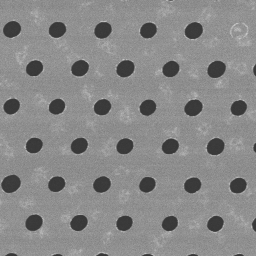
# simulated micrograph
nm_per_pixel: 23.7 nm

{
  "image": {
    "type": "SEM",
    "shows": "a regular array of holes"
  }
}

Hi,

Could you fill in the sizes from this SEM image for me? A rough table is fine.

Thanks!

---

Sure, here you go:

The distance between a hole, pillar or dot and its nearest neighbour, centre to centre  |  1050 nm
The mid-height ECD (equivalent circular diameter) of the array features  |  393 nanometers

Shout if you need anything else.